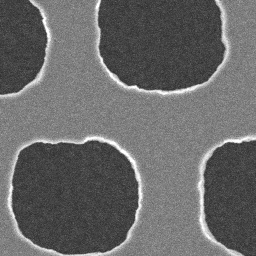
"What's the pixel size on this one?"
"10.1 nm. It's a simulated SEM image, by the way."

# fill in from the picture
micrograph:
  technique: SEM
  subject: holes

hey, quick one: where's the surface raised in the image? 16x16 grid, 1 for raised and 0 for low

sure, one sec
0011110000000011
0001110000000011
0001110000000011
0001110000000011
0011111000000111
0111111110001111
1111111111111111
1111111111111111
1111111111111111
1000000011111000
1000000011111000
1000000001111000
1000000001111000
1000000011111000
1000000011111000
1110000111111100